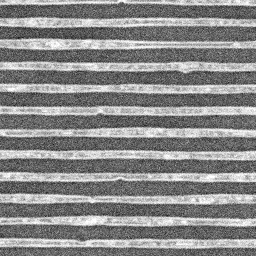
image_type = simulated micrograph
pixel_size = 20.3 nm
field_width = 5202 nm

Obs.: parallel lines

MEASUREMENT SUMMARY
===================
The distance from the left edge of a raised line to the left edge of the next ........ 449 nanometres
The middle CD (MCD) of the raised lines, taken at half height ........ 150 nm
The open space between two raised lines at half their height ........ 14.7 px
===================